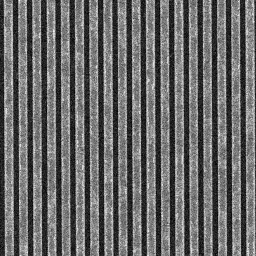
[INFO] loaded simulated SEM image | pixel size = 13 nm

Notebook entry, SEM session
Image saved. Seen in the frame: parallel lines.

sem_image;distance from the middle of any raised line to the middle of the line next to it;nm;185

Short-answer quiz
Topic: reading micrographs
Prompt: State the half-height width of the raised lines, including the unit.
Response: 104 nanometres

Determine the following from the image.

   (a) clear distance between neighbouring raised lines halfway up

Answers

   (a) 6.13 pixels